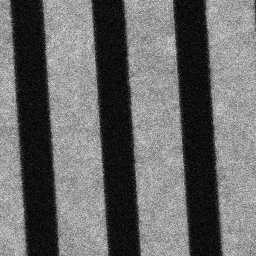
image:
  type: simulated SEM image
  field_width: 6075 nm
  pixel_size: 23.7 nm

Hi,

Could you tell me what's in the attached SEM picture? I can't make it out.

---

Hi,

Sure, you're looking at one or a few lines or trenches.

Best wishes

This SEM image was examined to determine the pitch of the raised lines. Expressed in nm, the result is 1930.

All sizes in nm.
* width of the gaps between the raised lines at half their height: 1130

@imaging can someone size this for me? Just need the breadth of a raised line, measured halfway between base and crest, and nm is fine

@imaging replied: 793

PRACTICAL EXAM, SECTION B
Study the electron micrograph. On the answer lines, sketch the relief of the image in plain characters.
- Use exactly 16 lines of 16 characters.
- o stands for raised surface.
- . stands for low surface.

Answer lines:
.oo...oo...oo...
.oo...oo...oo...
.oo...oo...oo...
.oo...oo...oo...
.oo...oo...oo...
.oo...oo...oo...
.oo...oo...oo...
.oo...oo...oo...
.oo...oo...oo...
.oo...oo...oo...
.oo...oo...ooo..
.oo...ooo...oo..
.oo....oo...oo..
..oo...oo...oo..
..oo...oo...oo..
..oo...oo...oo..